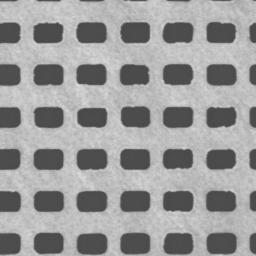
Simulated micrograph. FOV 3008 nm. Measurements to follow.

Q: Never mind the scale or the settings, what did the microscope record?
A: a regular array of holes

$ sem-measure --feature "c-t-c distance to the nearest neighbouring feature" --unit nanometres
494